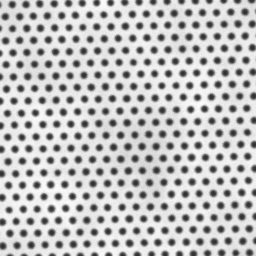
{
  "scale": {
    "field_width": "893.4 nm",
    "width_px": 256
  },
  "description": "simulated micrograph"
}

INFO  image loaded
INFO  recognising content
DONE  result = a regular array of holes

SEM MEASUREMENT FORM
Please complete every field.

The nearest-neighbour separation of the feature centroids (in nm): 47.6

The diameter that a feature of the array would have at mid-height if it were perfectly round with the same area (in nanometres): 27.3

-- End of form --